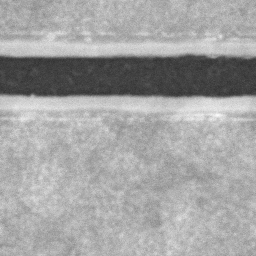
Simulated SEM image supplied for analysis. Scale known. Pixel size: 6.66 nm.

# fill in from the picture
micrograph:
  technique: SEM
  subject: one or a few lines or trenches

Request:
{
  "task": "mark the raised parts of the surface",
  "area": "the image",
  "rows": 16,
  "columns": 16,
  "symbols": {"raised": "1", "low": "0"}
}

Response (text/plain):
1111111111111111
1111111111111111
1111111111111111
0000000000000000
0000000000000000
0000000000000000
1101111000000000
1111111111111111
1111111111111111
1111111111111111
1111111111111111
1111111111111111
1111111111111111
1111111111111111
1111111111111111
1111111111111111